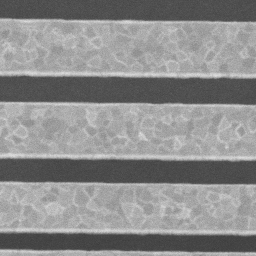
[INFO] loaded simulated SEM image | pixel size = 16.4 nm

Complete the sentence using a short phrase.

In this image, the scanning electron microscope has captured lines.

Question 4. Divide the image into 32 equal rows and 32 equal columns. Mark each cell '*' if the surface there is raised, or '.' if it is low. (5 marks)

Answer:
................................
................................
********........................
********************************
********************************
********************************
********************************
********************************
********************************
................*..*.***********
................................
................................
................................
********************************
********************************
********************************
********************************
********************************
********************************
********************************
................................
................................
................................
********************************
********************************
********************************
********************************
********************************
********************************
................................
................................
***********************.........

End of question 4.